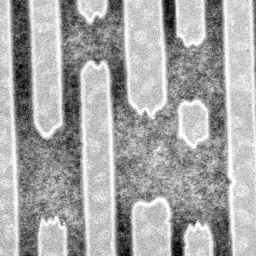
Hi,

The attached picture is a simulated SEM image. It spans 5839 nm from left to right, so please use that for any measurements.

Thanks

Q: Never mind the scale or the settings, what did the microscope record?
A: parallel lines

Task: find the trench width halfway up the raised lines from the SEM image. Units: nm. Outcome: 484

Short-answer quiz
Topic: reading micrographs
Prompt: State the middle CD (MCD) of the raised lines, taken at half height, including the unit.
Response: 618 nanometres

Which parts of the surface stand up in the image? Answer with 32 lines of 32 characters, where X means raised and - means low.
X---XXX---XXX---XXXX--XXX---XXX-
X---XXX---XXX---XXXX--XXX---XXX-
X---XXX---------XXXX--XXX---XXX-
X---XXX---------XXXX--XXX---XXXX
X---XXX---------XXXX--XXX---XXXX
X---XXX---------XXXX--------XXXX
X---XXX---------XXXX--------XXXX
X---XXX---------XXXX--------XXXX
X---XXX----XX---XXXX--------XXXX
X---XXXX--XXXX--XXXX--------XXXX
X---XXXX--XXXX--XXXXX-------XXXX
X---XXXX--XXXX--XXXXX-------XXXX
X---XXXX--XXXX--XXXXX--------XXX
XX--XXXX--XXXX---XXX---XXX---XXX
XX--XXXX--XXXX---------XXX---XXX
XX---XX---XXXX---------XXX---XXX
XX---X----XXXX---------XXX---XXX
XX--------XXXX---------XX----XXX
XX---------XXX---------------XXX
XX---------XXX---------------XXX
XX---------XXX---------------XXX
XX---------XXX---------------XXX
XX---------XXX---------------XXX
XX---------XXX---------------XXX
XX---------XXX---------------XXX
XX---------XXX---X-XX--------XXX
XX---------XXX---XXXX--------XXX
XX---------XXX---XXXX--------XXX
XX---XXX---XXX---XXXX---XX---XXX
XX---XXX---XXX---XXXX--XXX---XXX
XX---XXX---XXX---XXXX--XXX---XXX
XX---XXX---XXX---XXXX--XXX---XXX